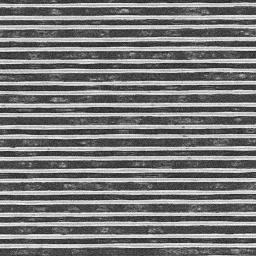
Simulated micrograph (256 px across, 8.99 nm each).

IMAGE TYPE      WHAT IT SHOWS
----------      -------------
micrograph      parallel lines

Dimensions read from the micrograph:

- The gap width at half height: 69.7 nm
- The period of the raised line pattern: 98.3 nanometers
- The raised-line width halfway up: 32.6 nm